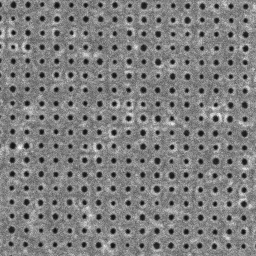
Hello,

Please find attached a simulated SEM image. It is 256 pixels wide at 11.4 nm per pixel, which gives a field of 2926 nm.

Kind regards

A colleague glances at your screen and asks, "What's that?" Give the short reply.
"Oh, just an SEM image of a regular array of holes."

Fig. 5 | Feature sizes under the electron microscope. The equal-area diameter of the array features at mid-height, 64.5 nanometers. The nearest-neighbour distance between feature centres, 158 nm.